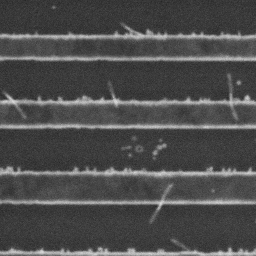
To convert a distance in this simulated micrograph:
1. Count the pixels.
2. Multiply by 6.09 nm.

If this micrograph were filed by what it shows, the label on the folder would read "lines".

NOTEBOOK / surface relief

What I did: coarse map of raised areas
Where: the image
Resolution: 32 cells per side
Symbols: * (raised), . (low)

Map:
................................
................................
................................
................................
******************************.*
********************************
********************************
................................
................................
................................
................................
................................
.*............*.................
********************************
********************************
********************************
................................
................................
................................
................................
................................
*..*.*....**....**..............
********************************
********************************
********************************
...................**...........
................................
................................
................................
................................
................................
********.**...........***.......